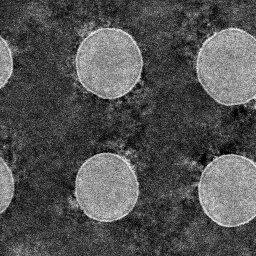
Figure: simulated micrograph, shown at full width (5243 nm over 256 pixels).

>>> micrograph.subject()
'raised bodies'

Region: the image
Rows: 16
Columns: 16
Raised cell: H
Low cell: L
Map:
LLLLLLLLLLLLLLLL
LLLLLLLLLLLLLLLL
LLLLLHHHLLLLLHHH
HLLLLHHHHLLLHHHH
HLLLLHHHHLLLHHHH
LLLLLHHHLLLLLHHH
LLLLLLLLLLLLLLHL
LLLLLLLLLLLLLLLL
LLLLLLLLLLLLLLLL
LLLLLLLLLLLLLLLL
HLLLLHHHLLLLLHHH
HLLLLHHHHLLLHHHH
HLLLLHHHHLLLLHHH
LLLLLLHHLLLLLHHH
LLLLLLLLLLLLLLLL
LLLLLLLLLLLLLLLL